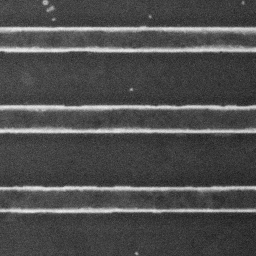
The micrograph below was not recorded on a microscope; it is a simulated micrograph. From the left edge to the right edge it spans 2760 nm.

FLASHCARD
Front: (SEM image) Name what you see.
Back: lines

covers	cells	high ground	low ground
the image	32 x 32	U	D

DDDDDDDDDDDDDDDDDDDDDDDDDDDDDDDD
DDDDDDDDDDDDDDDDDDDDDDDDDDDDDDDD
DDDDDDDDDDDDDDDDDDDDDDDDDDDDDDDD
DDDDDDDDDDDDDDDDDDDDDDDDDDDDDDDD
UUUUUUUUUUUUUUUUUUUUUUUUUUUUUUUU
UUUUUUUUUUUUUUUUUUUUUUUUUUUUUUUU
DDDDDDDDDDDDDDDDDDDDDDDDDDDDDDDD
DDDDDDDDDDDDDDDDDDDDDDDDDDDDDDDD
DDDDDDDDDDDDDDDDDDDDDDDDDDDDDDDD
DDDDDDDDDDDDDDDDDDDDDDDDDDDDDDDD
DDDDDDDDDDDDDDDDDDDDDDDDDDDDDDDD
DDDDDDDDDDDDDDDDDDDDDDDDDDDDDDDD
DDDDDDDDDDDDDDDDDDDDDDDDDDDDDDDD
UUUUUUUUUDUUUUUUUUUUUUUUUUUUUUUU
UUUUUUUUUUUUUUUUUUUUUUUUUUUUUUUU
UUUUUUUUUUUUUUUUUUUUUUUUUUUUUUUU
DDDDDDDDDDDDDDDDDDDDDDDDDDDDDDDD
DDDDDDDDDDDDDDDDDDDDDDDDDDDDDDDD
DDDDDDDDDDDDDDDDDDDDDDDDDDDDDDDD
DDDDDDDDDDDDDDDDDDDDDDDDDDDDDDDD
DDDDDDDDDDDDDDDDDDDDDDDDDDDDDDDD
DDDDDDDDDDDDDDDDDDDDDDDDDDDDDDDD
DDDDDDDDDDDDDDDDDDDDDDDDDDDDDDDD
UUUUUUUUUUUUUUUUUDDUUUUUUDUUUUUU
UUUUUUUUUUUUUUUUUUUUUUUUUUUUUUUU
UUUUUUUUUUUUUUUUUUUUUUUUUUUUUUUU
DDDDDDDDDDDDDDDDDDDDDDDDDDDDDDDD
DDDDDDDDDDDDDDDDDDDDDDDDDDDDDDDD
DDDDDDDDDDDDDDDDDDDDDDDDDDDDDDDD
DDDDDDDDDDDDDDDDDDDDDDDDDDDDDDDD
DDDDDDDDDDDDDDDDDDDDDDDDDDDDDDDD
DDDDDDDDDDDDDDDDDDDDDDDDDDDDDDDD